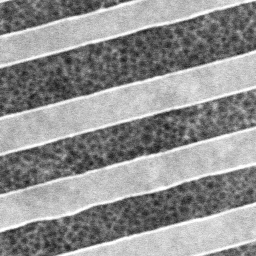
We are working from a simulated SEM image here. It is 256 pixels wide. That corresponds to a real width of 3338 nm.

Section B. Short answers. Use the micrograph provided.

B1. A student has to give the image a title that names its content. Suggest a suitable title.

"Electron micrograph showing one or a few lines or trenches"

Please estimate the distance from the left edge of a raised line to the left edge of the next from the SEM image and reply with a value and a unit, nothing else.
994 nanometres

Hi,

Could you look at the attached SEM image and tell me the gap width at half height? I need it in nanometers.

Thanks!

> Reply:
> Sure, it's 529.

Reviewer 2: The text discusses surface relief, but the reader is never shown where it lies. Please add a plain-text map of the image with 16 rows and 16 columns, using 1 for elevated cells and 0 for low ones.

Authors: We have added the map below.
0000000111111100
0001111111000000
1111110000000000
1110000000000001
0000000000011111
0000000111111111
0000111111110000
1111111100000000
1111000000000011
1000000000111111
0000000111111110
0001111111100000
1111111000000000
1111000000000111
0000000001111111
0000001111111100